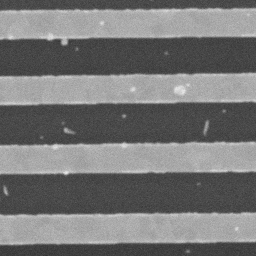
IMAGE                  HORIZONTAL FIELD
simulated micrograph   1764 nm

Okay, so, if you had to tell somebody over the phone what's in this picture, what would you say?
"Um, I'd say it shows lines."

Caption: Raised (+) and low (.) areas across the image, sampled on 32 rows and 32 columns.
................................
++++++++++++++++++++++++++++++++
++++++++++++++++++++++++++++++++
++++++++++++++++++++++++++++++++
++++++++++++++++++++++++++++++++
................................
................................
................................
................................
.............+++++++++++++++++++
++++++++++++++++++++++++++++++++
++++++++++++++++++++++++++++++++
++++++++++++++++++++++++++++++++
................................
................................
................................
................................
................................
++++++++++++++++++++++++++++++++
++++++++++++++++++++++++++++++++
++++++++++++++++++++++++++++++++
+++++++++++++++++++++...........
................................
................................
................................
................................
................................
++++++++++++++++++++++++++++++++
++++++++++++++++++++++++++++++++
++++++++++++++++++++++++++++++++
+++++..+........................
................................